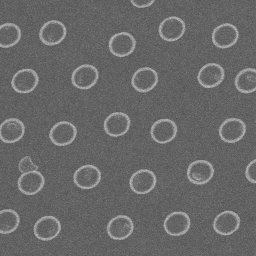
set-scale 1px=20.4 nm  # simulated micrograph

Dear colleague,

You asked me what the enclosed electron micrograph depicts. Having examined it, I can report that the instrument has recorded a regular array of raised bodies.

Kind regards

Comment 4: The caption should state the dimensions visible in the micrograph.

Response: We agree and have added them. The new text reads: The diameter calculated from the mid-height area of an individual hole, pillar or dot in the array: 0.474 microns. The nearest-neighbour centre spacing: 1.01 um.